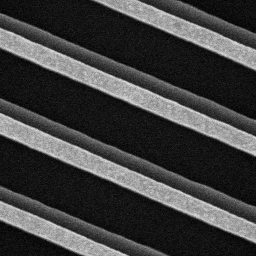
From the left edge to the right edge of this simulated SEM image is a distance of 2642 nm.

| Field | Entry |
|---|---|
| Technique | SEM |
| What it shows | lines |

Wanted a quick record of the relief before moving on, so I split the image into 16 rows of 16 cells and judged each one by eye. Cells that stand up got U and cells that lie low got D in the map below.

DDDDDDDUUUUUDDDD
UUDDDDDDDUUUUUDD
UUUUDDDDDDDDUUUU
DUUUUUDDDDDDDDUU
DDDDUUUUUDDDDDDD
DDDDDDUUUUUDDDDD
UDDDDDDDUUUUUUDD
UUUDDDDDDDDUUUUU
UUUUUDDDDDDDDUUU
DDDUUUUUDDDDDDDU
DDDDDUUUUUDDDDDD
DDDDDDDUUUUUDDDD
UUDDDDDDDDUUUUUD
UUUUDDDDDDDDUUUU
DDUUUUUDDDDDDDUU
DDDDUUUUUDDDDDDD